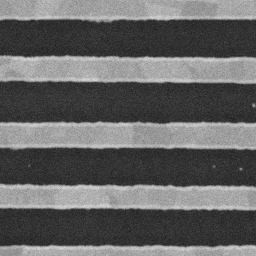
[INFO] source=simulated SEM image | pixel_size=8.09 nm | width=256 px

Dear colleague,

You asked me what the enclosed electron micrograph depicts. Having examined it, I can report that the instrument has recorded lines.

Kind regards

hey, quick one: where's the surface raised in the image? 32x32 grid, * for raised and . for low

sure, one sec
********************************
********************************
................................
................................
................................
................................
................................
********************************
********************************
********************************
................................
................................
................................
................................
................................
********************************
********************************
********************************
....................**..********
................................
................................
................................
................................
********************************
********************************
********************************
................................
................................
................................
................................
................................
********************************